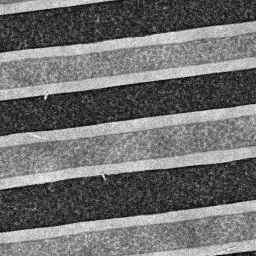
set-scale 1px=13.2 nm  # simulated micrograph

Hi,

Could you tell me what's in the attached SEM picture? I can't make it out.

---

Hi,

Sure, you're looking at one or a few lines or trenches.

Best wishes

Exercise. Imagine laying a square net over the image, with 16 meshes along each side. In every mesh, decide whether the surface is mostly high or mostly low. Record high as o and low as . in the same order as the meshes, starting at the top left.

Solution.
oo..............
................
.........ooooooo
.ooooooooooooooo
oooooooooooo....
oooo............
................
..........oooooo
..oooooooooooooo
oooooooooooooooo
oooooooo........
o...............
................
...........ooooo
...ooooooooooooo
ooooooooooooooo.